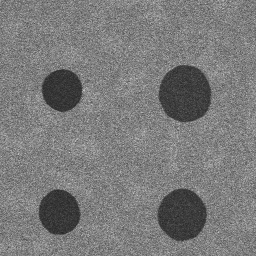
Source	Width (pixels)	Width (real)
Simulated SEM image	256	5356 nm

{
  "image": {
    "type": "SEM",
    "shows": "holes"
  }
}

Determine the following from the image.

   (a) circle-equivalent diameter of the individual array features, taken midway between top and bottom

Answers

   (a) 0.985 micrometres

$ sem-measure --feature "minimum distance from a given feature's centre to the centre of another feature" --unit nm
2540